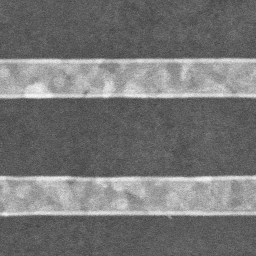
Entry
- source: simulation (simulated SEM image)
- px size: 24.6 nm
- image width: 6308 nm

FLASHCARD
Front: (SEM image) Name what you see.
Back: one or a few lines or trenches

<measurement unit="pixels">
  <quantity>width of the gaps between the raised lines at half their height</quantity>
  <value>82.6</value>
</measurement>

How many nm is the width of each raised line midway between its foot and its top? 863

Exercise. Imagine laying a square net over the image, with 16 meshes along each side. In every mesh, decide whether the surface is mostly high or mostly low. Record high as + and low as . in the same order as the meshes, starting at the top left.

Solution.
................
................
................
................
++++++++++++++++
++++++++++++++++
................
................
................
................
................
++++++++++++++++
++++++++++++++++
................
................
................